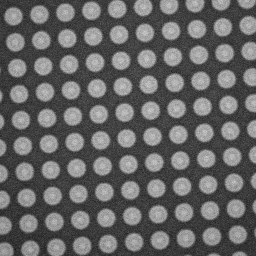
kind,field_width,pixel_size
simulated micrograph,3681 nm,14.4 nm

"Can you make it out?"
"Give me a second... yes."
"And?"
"an array of small figures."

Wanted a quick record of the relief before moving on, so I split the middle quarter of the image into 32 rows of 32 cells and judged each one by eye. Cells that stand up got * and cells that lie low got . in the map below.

***...****..****...***..........
***...***.......................
................................
....................***...***...
.**....***...****..****...****..
****..****...****..****...****..
****..****...****..****...***...
****..****....**................
.**.............................
.....................*.....***..
........*.....***...****..****..
.***...****..****..*****..****..
****..*****..****...****..****..
****...****..****....**.........
.***...***......................
................................
...............*.....***...***..
..**....***...****..****..*****.
.****..****..*****..****...****.
.****..****...****..****...***..
.****..****....**...............
..**............................
......................*.....***.
.........*.....***...***...****.
..***...****..****..*****..****.
.****..*****..****...****..****.
.****...****..****...***........
.****....**.....................
................................
................*.....***...***.
...**....***...****..****..*****
..****..****..*****..****..*****